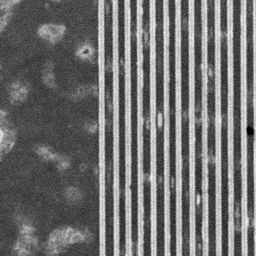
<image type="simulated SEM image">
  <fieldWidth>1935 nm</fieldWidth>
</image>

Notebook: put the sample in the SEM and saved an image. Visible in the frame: parallel lines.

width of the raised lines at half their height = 4.38 px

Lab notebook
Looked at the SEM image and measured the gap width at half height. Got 67.1 nanometers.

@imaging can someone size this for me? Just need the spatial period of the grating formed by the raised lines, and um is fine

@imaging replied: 0.0975